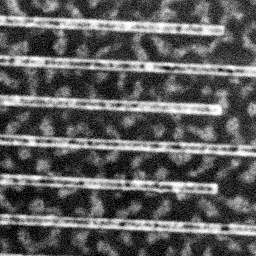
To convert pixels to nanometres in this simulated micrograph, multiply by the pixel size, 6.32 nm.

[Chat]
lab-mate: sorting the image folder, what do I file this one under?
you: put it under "parallel lines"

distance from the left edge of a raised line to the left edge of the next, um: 0.25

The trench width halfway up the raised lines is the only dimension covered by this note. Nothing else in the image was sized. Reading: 32.7 px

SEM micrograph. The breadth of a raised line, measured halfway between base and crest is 45.8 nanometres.